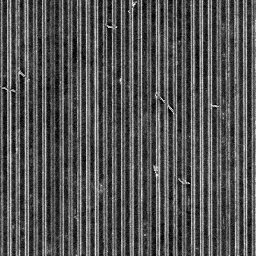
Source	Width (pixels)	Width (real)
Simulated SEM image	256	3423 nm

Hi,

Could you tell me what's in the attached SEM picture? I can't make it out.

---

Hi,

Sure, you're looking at parallel lines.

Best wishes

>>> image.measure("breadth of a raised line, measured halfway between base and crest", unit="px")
2.75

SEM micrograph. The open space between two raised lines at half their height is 5.38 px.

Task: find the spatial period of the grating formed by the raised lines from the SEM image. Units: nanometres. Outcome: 117